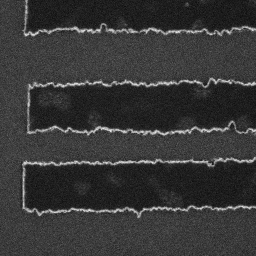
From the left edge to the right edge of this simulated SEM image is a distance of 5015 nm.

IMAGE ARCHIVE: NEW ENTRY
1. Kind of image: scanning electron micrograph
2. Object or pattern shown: one or a few lines or trenches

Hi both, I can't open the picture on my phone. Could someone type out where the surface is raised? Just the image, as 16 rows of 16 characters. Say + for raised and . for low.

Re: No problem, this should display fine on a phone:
..++++++++++++++
..++++++++++++++
................
................
................
..++++++++++++++
..++++++++++++++
..++++++++++++++
................
................
..++++++++++++++
.+++++++++++++++
.+++++++++++++++
................
................
................